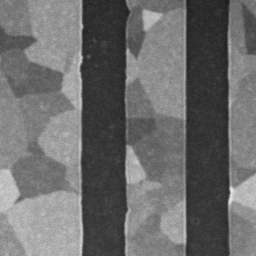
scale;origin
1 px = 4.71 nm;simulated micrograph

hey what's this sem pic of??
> one or a few lines or trenches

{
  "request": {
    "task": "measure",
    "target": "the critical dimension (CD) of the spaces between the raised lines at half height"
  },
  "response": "0.21 um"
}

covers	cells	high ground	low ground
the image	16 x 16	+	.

+++++...++++..++
+++++...++++..++
+++++...++++..++
+++++...++++..++
+++++...++++..++
+++++...++++..++
+++++...++++..++
+++++...++++..++
+++++...++++..++
+++++...++++..++
+++++...++++..++
+++++...++++..++
+++++...++++..++
+++++...++++..++
+++++...++++..++
+++++...++++..++